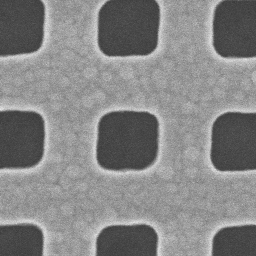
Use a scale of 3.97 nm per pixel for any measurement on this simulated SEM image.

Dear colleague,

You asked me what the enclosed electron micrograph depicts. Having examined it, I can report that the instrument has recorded holes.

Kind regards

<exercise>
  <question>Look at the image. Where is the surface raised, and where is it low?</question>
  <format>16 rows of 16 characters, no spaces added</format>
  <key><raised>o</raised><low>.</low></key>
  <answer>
...ooo....oooo..
...ooo....ooo...
...ooo....ooo...
.oooooo.oooooo..
oooooooooooooooo
oooooooooooooooo
oooooooooooooooo
...ooo....oooo..
...ooo....ooo...
...ooo....ooo...
..ooooo..ooooo..
oooooooooooooooo
oooooooooooooooo
oooooooooooooooo
...ooo....oooo..
...ooo....ooo...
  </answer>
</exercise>